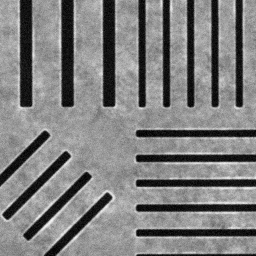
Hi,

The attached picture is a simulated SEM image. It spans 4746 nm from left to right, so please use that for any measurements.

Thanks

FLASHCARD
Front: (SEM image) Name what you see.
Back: groups of lines, slits or small figures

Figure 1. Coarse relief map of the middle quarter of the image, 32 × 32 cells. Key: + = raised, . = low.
...++++++....+++++...++++..++++.
...++++++....+++++...++++..++++.
...++++++....+++++...++++..++++.
...++++++....+++++...++++..++++.
...++++++....+++++...++++..++++.
...++++++....+++++...++++..++++.
...++++++....+++++...++++..++++.
...++++++....+++++...++++..++++.
...++++++....+++++...++++..++++.
...++++++....+++++...++++..++++.
..++++++++...++++++..++++.+++++.
++++++++++++++++++++++++++++++++
++++++++++++++++++++++++++++++++
++++++++++++++++++++++++++++++++
++++++++++++++++++++++++++++++++
++++++++++++++++++++++++++++++++
++++++++++++++++++..............
++++++++++++++++++..............
+++++++++++++++++++.............
++++++++++++++++++++++++++++++++
++++++++++++++++++++++++++++++++
++++++++++++++++++++++++++++++++
..+++++++++++++++++++++++.......
..++++++++++++++++..............
.+++++++++++++++++..............
++++++++++++++++++++++++++++++++
++++++++++++++++++++++++++++++++
+++++..+++++++++++++++++++++++++
++++...+++++++++++++++++++++++++
+++...++++++++++++..............
++...+++++++++++++..............
+...++++++++++++++++++++++++++++